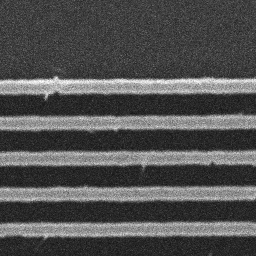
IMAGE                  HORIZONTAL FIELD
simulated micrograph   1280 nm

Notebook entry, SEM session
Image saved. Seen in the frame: parallel lines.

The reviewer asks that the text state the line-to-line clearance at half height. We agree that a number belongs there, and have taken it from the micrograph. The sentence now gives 119 nanometres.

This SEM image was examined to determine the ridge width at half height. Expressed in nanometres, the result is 59.4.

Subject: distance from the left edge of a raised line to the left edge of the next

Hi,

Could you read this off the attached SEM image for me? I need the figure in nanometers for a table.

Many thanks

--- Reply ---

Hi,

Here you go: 178